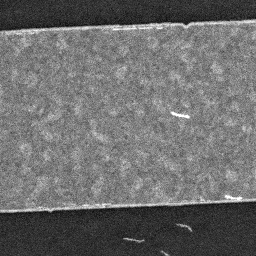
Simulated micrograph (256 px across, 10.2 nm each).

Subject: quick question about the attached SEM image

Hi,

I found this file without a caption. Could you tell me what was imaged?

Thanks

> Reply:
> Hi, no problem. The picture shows one or a few lines or trenches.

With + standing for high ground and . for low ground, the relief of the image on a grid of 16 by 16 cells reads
................
............++++
++++++++++++++++
++++++++++++++++
++++++++++++++++
++++++++++++++++
++++++++++++++++
++++++++++++++++
++++++++++++++++
++++++++++++++++
++++++++++++++++
++++++++++++++++
+++++++++++++++.
................
................
................